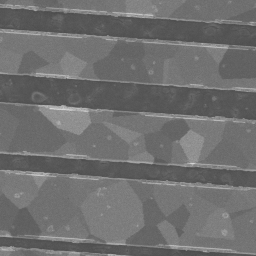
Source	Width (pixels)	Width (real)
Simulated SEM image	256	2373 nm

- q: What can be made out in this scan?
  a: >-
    one or a few lines or trenches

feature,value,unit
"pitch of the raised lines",0.703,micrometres